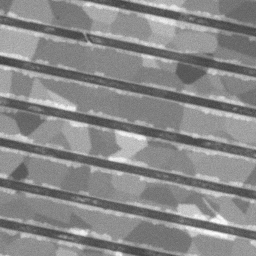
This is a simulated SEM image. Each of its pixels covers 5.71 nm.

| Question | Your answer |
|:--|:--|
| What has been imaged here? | parallel lines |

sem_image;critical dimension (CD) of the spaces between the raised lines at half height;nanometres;53.1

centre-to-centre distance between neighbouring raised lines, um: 0.227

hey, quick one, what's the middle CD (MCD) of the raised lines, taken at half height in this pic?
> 175 nm